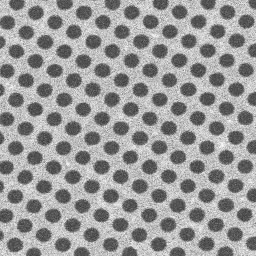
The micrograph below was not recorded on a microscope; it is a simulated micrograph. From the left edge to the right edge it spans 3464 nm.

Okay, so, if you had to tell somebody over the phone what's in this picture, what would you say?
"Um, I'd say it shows a regular array of holes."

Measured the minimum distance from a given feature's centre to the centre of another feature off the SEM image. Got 287 nm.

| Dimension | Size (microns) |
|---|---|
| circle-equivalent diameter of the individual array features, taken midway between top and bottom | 0.202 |